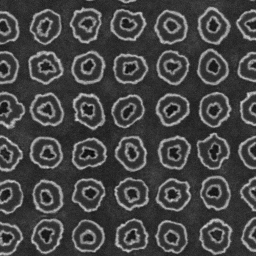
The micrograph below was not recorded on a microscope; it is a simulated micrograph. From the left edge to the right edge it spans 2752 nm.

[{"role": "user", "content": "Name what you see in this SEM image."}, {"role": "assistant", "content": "a regular array of ring-shaped raised bodies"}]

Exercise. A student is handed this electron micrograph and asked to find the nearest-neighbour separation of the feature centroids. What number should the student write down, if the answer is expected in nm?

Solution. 433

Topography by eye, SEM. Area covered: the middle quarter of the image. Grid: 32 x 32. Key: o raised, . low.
..ooo..ooo...oo...oo...oo....oo.
..ooo..ooo...oo...ooo...oo..ooo.
..ooooooo....oo.oooo....oooooo..
...oooooo....ooooooo.....ooooo..
....ooo........o.o........ooo...
................................
................................
................................
....oooo.......oooo......ooooo..
...oooooo....oooooo.....ooooooo.
..ooo..oo....ooo..oo...ooo..ooo.
...oo..ooo..ooo..ooo...oo...ooo.
...oo..ooo..ooo..ooo....oo.oooo.
...ooooooo...oo.ooo.....oooooo..
....oooooo...ooooo.......ooo....
......oo......oo................
................................
................................
................oo..........o...
....ooooo.....ooooo......oooooo.
...ooooooo....oo.ooo....ooooooo.
...oo..ooo...ooo..oo....oo...oo.
...oo...oo...ooo..oo....oo...oo.
..oo.oooooo..ooo..oo....ooo..oo.
..oooooooo....oooooo....oooooo..
...ooo.........ooooo.....ooooo..
.................o..............
................................
................................
....ooooo......ooooo......ooo...
...ooooooo...oooooooo...ooooooo.
...oo...oo...ooo..ooo...oo..ooo.